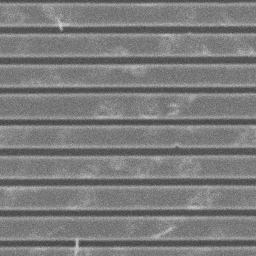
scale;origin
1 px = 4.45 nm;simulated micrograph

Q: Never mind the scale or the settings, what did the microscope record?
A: parallel lines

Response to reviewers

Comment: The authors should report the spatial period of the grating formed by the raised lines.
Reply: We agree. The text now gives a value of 30.5 px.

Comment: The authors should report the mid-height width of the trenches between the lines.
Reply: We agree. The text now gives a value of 33.4 nanometres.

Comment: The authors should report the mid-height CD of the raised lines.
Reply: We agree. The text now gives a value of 101 nm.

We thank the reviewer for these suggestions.